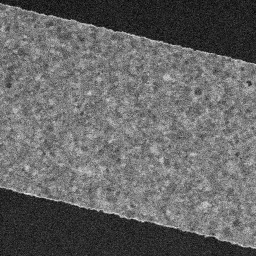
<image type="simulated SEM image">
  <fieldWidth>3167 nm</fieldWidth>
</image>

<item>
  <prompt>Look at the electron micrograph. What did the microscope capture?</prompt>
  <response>one or a few lines or trenches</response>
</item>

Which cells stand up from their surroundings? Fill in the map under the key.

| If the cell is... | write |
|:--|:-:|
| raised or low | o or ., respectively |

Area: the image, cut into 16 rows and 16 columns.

o...............
ooooo...........
oooooooooo......
oooooooooooooo..
oooooooooooooooo
oooooooooooooooo
oooooooooooooooo
oooooooooooooooo
oooooooooooooooo
oooooooooooooooo
oooooooooooooooo
oooooooooooooooo
...ooooooooooooo
........oooooooo
............oooo
................